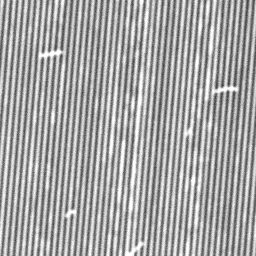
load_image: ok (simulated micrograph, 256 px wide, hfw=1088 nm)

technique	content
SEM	parallel lines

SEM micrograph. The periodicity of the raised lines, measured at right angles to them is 25.7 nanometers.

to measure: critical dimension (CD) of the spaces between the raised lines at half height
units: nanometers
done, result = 18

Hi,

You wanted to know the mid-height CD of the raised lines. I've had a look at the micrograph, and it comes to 7.4 nanometers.